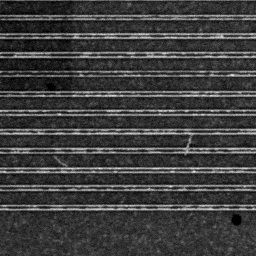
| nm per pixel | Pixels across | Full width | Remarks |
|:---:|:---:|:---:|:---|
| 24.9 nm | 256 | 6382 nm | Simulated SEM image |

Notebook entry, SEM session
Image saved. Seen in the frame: parallel lines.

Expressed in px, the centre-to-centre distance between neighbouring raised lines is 19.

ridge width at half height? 109 nanometers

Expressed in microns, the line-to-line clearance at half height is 0.371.